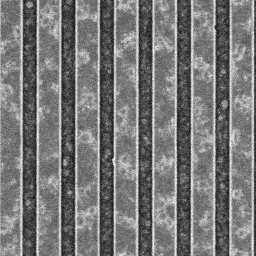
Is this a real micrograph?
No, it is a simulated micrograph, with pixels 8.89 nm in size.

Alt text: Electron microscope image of parallel lines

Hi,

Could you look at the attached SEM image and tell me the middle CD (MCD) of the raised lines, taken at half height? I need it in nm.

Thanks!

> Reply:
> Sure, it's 202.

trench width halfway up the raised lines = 140 nm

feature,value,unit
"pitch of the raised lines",0.342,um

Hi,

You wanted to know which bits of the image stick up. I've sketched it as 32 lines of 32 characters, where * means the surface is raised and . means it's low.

***..***..**..***..***..***..***
***..***..**..***..***..***..***
***..***..**..***..***..***..***
***..***..**..***..***..***..***
***..***..**..***..***..***..***
***..***..**..***..***..***..***
***..***..**..***..***..***..***
***..***..**..***..***..***..***
***..***..**..***..***..***..***
***..**...**..***..***..***..***
***..**...**..***..***..***..***
***..**...**..***..***..***..***
***..**...**..***..***..***..***
***..**...**..***..***..***..***
***..**...**..***..***..***..***
***..**...**..***..***..***..***
***..**...**..***..***..***..***
***..**...**..***..***..***..***
***..**...**..***..***..***..***
***..**...**..***..***..***..***
***..**...**..***..***..***..***
***..**...**..***..***..***..***
***..**...**..***..***..***..***
***..**...**..***..***..***..***
***..**...**..***..***..***..***
***..**...**..***..***..***..***
***..**...**..***..***..***..***
***..**...**..***..***..***..***
***..**...**..***..***..***..***
***..**...**..***..***..***..***
***..**...**..***..***..***..***
***..**...**..***..***..***..***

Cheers